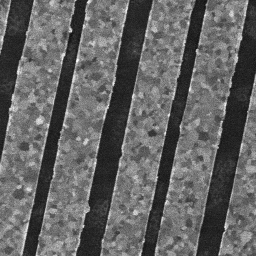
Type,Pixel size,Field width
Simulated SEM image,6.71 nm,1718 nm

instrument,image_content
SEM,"parallel lines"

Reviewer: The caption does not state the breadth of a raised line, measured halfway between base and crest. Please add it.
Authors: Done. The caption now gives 272 nm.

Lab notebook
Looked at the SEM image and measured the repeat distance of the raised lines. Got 383 nm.